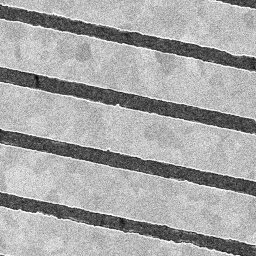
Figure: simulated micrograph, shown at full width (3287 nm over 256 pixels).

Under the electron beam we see one or a few lines or trenches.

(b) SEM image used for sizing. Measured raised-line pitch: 786 nm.